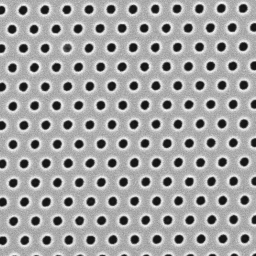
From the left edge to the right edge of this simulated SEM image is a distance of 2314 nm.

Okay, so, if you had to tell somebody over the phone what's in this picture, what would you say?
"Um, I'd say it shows a regular array of holes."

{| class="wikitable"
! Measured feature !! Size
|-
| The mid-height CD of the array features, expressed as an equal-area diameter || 0.0853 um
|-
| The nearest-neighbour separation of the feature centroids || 198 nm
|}